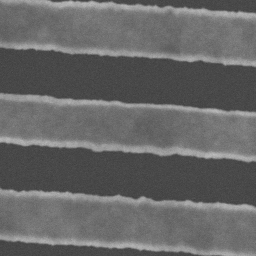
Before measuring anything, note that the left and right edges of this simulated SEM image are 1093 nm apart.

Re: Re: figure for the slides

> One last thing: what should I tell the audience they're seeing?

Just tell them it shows lines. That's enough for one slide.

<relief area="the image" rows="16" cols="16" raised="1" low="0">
1111111111100000
1111111111111111
1111111111111111
0000000001111111
0000000000000000
0000000000000000
1111111100000000
1111111111111111
1111111111111111
0000000000111111
0000000000000000
0000000000000000
1111111110000000
1111111111111111
1111111111111111
0000000011111111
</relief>